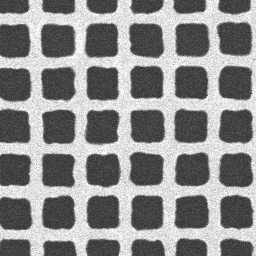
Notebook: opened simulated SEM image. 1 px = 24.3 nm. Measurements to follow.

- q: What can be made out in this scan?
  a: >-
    a regular array of holes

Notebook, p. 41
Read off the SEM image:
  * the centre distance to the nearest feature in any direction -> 1040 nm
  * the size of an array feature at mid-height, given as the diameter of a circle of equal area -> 884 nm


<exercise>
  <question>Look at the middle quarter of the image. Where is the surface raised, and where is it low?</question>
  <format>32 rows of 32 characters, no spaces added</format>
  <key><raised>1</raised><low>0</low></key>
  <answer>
10111110011111111100000111111000
00111100000000111000000011110000
00011100000000111000000001110000
00011100000000111000000001110000
00011100000000111000000001100000
00011100000000111000000001110000
00011100000000111000000001110000
00011100000000111000000001110000
00111100000001111000000011111000
11111111111111111111111111111111
11111111111111111111111111111111
01111110010011111100000011111011
00011100000000111000000001110000
00011100000000111000000001110000
00011100000000110000000001100000
00011100000000111000000001110000
00011000000001111000000001110000
00011000000001111000000001110000
00011000000000111000000001110000
00111100000001111100000011111000
11111111111111111111111111111111
11111111111111111111111111111111
00111110011001111000001111111111
00011100000000111000000001110000
00011000000000111000000001110000
00011000000000111000000001110000
00111000000000110000000001110000
00111100000000110000000001110000
00111000000000110000000001110000
00011100000000111000000001110000
00111111000011111100000111111111
11111111111111111111111111111111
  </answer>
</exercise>